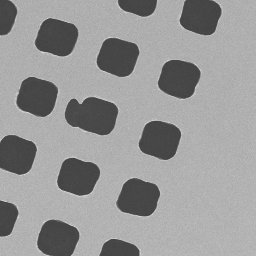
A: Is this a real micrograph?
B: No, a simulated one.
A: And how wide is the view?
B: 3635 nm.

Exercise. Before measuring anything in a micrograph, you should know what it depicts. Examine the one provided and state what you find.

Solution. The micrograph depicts a regular array of holes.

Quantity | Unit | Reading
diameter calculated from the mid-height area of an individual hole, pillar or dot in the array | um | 0.566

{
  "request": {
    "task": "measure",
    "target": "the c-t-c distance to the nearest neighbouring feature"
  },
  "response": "62.1 px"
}